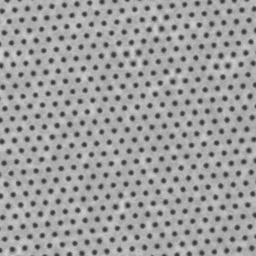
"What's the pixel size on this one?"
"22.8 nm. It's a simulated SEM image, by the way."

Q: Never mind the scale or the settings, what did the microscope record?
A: a regular array of holes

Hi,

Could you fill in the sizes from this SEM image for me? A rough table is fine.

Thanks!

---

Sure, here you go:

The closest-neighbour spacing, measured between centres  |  278 nm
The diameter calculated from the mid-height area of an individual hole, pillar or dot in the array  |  136 nm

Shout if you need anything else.